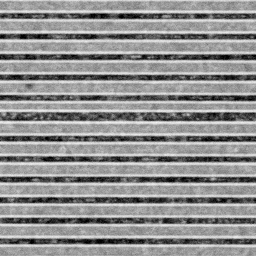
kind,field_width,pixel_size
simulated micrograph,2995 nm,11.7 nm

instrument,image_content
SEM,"parallel lines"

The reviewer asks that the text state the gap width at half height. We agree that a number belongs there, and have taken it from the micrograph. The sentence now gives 8.5 px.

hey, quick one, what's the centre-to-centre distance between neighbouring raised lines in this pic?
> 240 nm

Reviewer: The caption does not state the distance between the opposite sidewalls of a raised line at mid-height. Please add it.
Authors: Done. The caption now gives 139 nanometers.